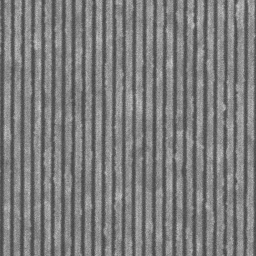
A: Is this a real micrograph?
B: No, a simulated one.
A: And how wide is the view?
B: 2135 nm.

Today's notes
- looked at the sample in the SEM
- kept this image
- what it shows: parallel lines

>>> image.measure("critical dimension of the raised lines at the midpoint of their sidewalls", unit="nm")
43.8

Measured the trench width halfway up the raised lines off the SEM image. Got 36.5 nanometres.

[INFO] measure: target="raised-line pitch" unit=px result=10.1